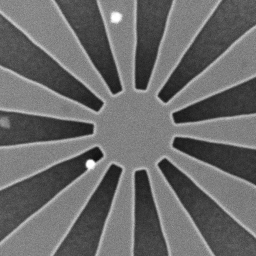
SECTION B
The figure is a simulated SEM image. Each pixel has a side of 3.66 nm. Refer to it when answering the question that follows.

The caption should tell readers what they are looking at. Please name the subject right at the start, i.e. groups of lines, slits or small figures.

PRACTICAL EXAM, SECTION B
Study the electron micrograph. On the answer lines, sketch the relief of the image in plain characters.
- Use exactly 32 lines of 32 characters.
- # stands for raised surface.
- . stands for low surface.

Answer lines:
#######.....#####.....#####.....
########.....####....######.....
.#######.....####....#####......
..#######....####....####.......
...#######...####...#####.....##
....######....###...####.....###
......#####...###...###.....####
.......####...###...###....#####
#.......####...##..###....######
###......####..##..##....#######
#####.....###..##..##..#######..
#######....###.#####..######....
#########....#######.####.......
###########..##########.........
.....#################........##
...........#####################
............####################
.......###############...#######
######################.........#
##########...###########........
#######....#########..####......
#####......##..##.##...#####....
###......####..##..##...#######.
#.......####...##..##....#######
.......####...###..###....######
......#####...###..####....#####
.....#####....###...###.....####
...#######...####...####.....###
..#######....####...#####.....##
.#######.....####...#####.......
########....#####....#####......
#######.....#####....######.....